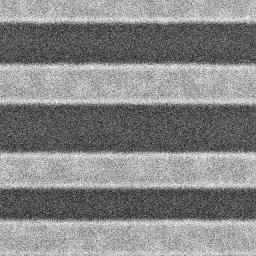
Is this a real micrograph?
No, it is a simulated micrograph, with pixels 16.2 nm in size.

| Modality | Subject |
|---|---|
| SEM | one or a few lines or trenches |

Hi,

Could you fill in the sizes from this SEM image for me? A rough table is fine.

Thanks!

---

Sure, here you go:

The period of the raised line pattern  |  77 pixels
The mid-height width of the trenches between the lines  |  0.738 um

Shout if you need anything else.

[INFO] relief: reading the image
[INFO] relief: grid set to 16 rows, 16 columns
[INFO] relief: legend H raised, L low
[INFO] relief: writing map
HHHHHHHHHHHHHHHH
LLLLLLLLLLLLLLLL
LLLLLLLLLLLLLLLL
LLLLLLLLLLLLLLLL
HHHHHHHHHHHHHHHH
HHHHHHHHHHHHHHHH
LLLLLLLLLLLLLLLL
LLLLLLLLLLLLLLLL
LLLLLLLLLLLLLLLL
LLLLLLLLLLLLLLLL
HHHHHHHHHHHHHHHH
HHHHHHHHHHHHHHHH
LLLLLLLLLLLLLLLL
LLLLLLLLLLLLLLLL
HHHHHHHHHHHHHHHH
HHHHHHHHHHHHHHHH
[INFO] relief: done